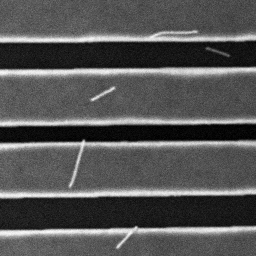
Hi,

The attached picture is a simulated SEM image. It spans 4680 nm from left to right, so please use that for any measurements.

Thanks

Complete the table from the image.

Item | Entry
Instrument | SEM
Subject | lines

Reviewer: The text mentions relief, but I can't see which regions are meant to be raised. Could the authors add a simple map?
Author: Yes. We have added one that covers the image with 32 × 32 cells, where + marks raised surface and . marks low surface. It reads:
++++++++++++++++++++++++++++++++
++++++++++++++++++++++++++++++++
++++++++++++++++++++++++++++++++
++++++++++++++++++++++++++++++++
++++++++++++++++++++++++++++++++
................................
................................
................................
............................++++
++++++++++++++++++++++++++++++++
++++++++++++++++++++++++++++++++
++++++++++++++++++++++++++++++++
++++++++++++++++++++++++++++++++
++++++++++++++++++++++++++++++++
++++++++++++++++++++++++++++++++
++++++++++++++++++..+...........
................................
................................
++++++++++++++++++++++++++++++++
++++++++++++++++++++++++++++++++
++++++++++++++++++++++++++++++++
++++++++++++++++++++++++++++++++
++++++++++++++++++++++++++++++++
++++++++++++++++++++++++++++++++
+++++++++.......................
................................
................................
................................
.................+........++++++
++++++++++++++++++++++++++++++++
++++++++++++++++++++++++++++++++
++++++++++++++++++++++++++++++++